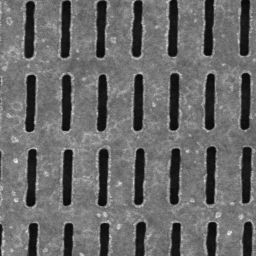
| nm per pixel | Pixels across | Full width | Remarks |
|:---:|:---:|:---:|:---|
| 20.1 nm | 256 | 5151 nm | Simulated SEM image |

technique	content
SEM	a regular array of holes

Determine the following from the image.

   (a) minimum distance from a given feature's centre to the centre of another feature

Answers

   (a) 719 nm